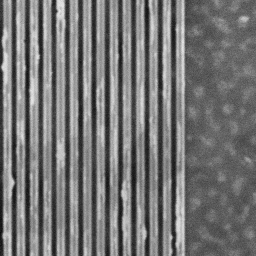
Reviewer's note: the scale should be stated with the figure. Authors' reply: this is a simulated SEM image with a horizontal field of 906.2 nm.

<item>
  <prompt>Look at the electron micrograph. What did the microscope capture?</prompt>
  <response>parallel lines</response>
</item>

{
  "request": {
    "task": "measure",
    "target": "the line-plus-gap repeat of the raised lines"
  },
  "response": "47 nm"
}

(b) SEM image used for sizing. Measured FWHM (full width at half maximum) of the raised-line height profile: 23 nm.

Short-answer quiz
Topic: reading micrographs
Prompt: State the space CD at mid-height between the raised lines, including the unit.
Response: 23 nanometres